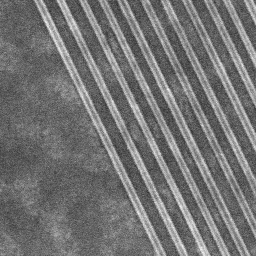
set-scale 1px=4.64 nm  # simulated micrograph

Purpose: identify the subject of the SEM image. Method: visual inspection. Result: parallel lines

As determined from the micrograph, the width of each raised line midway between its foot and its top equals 31.3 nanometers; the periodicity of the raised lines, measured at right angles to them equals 0.0881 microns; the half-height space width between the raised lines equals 57.4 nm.